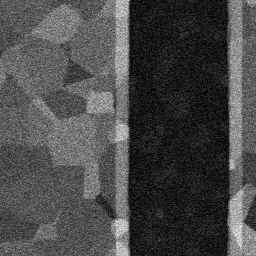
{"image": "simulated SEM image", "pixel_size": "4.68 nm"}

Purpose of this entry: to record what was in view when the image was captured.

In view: one or a few lines or trenches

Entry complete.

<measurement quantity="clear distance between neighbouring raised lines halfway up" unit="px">115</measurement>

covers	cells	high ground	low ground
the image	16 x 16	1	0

1111111100000001
1111111100000001
1111111100000001
1111111100000001
1111111100000001
1111111100000001
1111111100000001
1111111100000001
1111111100000001
1111111100000001
1111111100000001
1111111100000001
1111111100000001
1111111100000001
1111111100000001
1111111100000001